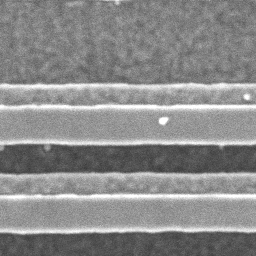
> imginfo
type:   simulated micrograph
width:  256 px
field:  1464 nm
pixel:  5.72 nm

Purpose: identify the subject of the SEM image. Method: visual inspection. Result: lines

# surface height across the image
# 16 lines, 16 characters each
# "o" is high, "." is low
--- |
................
................
................
................
................
oooooooooooooooo
oooooooooooooooo
oooooooooooooooo
oooooooooooooooo
................
................
oooooooooooooooo
oooooooooooooooo
oooooooooooooooo
ooooo.o.........
................